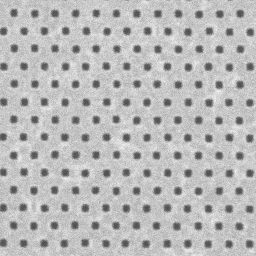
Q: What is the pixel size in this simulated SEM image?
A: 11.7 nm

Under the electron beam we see a regular array of holes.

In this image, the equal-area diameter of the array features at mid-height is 8.96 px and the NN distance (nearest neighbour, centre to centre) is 234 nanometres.